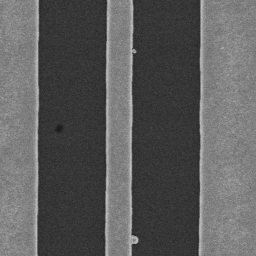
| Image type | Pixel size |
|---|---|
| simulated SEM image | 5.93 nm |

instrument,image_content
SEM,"wiring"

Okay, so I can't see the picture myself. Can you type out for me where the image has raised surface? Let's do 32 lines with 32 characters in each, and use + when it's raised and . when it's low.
+++++.........++.........+++++++
+++++.........++.........+++++++
+++++.........++.........+++++++
+++++........+++.........+++++++
+++++........+++.........+++++++
+++++........+++.........+++++++
+++++........+++.........+++++++
+++++........+++.........+++++++
+++++........+++.........+++++++
+++++........+++.........+++++++
+++++........+++.........+++++++
+++++........+++.........+++++++
+++++........+++.........+++++++
+++++........+++.........+++++++
+++++........+++.........+++++++
+++++........+++.........+++++++
+++++........+++.........+++++++
+++++........+++.........+++++++
+++++........+++.........+++++++
+++++........+++.........+++++++
+++++........+++.........+++++++
+++++........+++.........+++++++
+++++........+++.........+++++++
+++++........+++.........+++++++
+++++........+++.........+++++++
+++++........+++.........+++++++
+++++........+++.........+++++++
+++++........+++.........+++++++
++++.........+++.........+++++++
+++++........+++.........+++++++
+++++........+++.........+++++++
+++++........+++.........+++++++